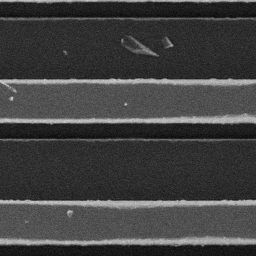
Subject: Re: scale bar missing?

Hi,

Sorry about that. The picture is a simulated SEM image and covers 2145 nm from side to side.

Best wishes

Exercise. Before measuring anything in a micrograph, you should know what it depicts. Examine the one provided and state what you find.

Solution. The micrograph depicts lines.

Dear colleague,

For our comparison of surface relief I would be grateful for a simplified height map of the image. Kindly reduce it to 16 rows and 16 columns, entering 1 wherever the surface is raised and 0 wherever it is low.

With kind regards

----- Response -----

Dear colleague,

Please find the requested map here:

0000000000000000
0000000000000000
0000000000000000
0000000000000000
0000000000000000
1111111111111111
1111111111111111
1111111111111111
0000000000000000
0000000000000000
0000000000000000
0000000000000000
0000000000000000
1111111111111111
1111111111111111
0000000000000000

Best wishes